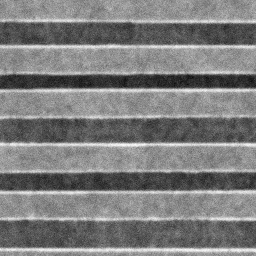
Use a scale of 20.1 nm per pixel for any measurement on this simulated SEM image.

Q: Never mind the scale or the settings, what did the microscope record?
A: lines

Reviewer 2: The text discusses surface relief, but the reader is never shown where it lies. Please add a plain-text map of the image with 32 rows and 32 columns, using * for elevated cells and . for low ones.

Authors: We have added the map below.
********************************
********************************
********************************
................................
................................
................................
********************************
********************************
********************************
................................
................................
********************************
********************************
********************************
********************************
................................
................................
................................
********************************
********************************
********************************
................................
................................
................................
********************************
********************************
********************************
................................
................................
................................
................................
********************************